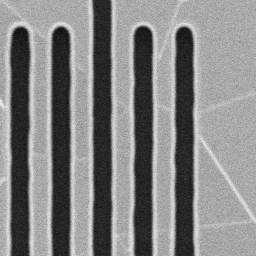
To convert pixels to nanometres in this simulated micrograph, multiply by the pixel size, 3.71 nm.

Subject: groups of lines, slits or small figures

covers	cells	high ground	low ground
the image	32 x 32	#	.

###########...##################
###########...##################
###########...##################
##.####.###...###..###..########
#...##...##...###..###..########
#...##...##...##...###..########
#...##...##...##...###..########
#...##...##...##...###..########
#...##...##...##...###..########
#...##...##...###..###..########
#...##...##...###..###..########
#...##...##...##...###..########
#...##...##...##...###..########
#...##...##...##...###..########
#...##...##...###..###..########
#...##...##...###..###..########
#...##...##...###..###..########
#...##...##...###..###..########
#...##...##...###..###..########
#...##...##...###..###..########
#...##...##...##...###..########
#...##...##...###..###..########
#...##...##...###..###..########
#...##...##...###..###..########
#...##...##...###..###..########
#...##...##...###..###..########
#...##...##...##...###..########
#...##...##...##...###..########
#...##...##...##...###..########
#...##...##...##...###..########
#...##...##...##...###..########
#...##...##...##...###...#######